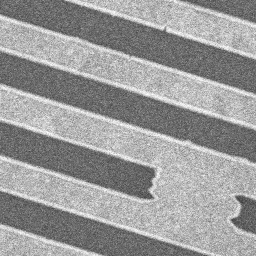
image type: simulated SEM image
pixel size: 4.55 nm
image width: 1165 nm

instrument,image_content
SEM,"one or a few lines or trenches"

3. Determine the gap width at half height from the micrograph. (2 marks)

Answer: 0.167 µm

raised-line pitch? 305 nm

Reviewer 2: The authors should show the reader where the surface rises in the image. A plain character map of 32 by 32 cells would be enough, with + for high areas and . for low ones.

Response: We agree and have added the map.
...........++++++++++++.........
..............++++++++++++......
+................++++++++++++...
++++.................+++++++++++
++++++++...............+++++++++
+++++++++++................+++++
..++++++++++++................++
.....++++++++++++...............
........++++++++++++............
...........+++++++++++++........
...............++++++++++++.....
++................++++++++++++..
++++++...............+++++++++++
+++++++++...............++++++++
++++++++++++................++++
..+++++++++++++................+
.....+++++++++++++..............
........++++++++++++++..........
............+++++++++++++.......
...............+++++++++++++....
++................+++++++++++++.
++++++..............++++++++++++
+++++++++..........+++++++++++++
++++++++++++.......+++++++++++++
...+++++++++++++...++++++++++..+
......++++++++++++++++++++++++..
..........++++++++++++++++++++..
.............++++++++++++++++...
+...............+++++++++++++...
++++...............++++++++++++.
+++++++...............++++++++++
++++++++++................++++++